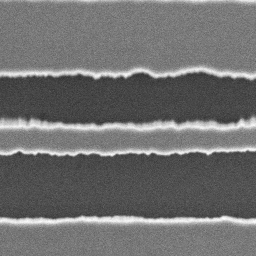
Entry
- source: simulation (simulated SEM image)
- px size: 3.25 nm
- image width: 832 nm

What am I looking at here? lines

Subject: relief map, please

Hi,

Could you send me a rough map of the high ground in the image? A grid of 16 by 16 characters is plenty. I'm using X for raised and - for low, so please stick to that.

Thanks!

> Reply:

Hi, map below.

XXXXXXXXXXXXXXXX
XXXXXXXXXXXXXXXX
XXXXXXXXXXXXXXXX
XXXXXXXXXXXXXXXX
XXXXXXXX-XXX-XXX
----------------
----------------
----------------
XXXXXXXXXXXXXXXX
XXXXXXXXXXXXXX--
----------------
----------------
----------------
----------------
XXXXXXXXXXXXXXXX
XXXXXXXXXXXXXXXX